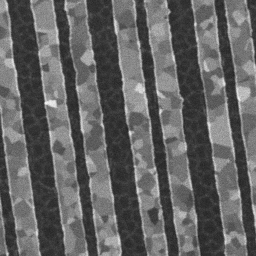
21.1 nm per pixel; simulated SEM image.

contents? parallel lines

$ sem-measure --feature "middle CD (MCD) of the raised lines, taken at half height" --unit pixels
20.4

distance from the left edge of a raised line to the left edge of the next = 849 nanometers